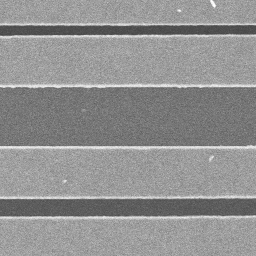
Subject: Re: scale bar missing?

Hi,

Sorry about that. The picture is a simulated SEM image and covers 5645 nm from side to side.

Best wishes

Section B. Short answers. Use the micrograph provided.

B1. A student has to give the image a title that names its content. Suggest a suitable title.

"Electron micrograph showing lines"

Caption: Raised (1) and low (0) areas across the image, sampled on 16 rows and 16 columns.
1111111111111111
1111111111111111
1111111111111111
1111111111111111
1111111111111111
0000000000000000
0000000000000000
0000000000000000
0000000000000000
1111111111111111
1111111111111111
1111111111111111
0000000000000000
0000000000000000
1111111111111111
1111111111111111